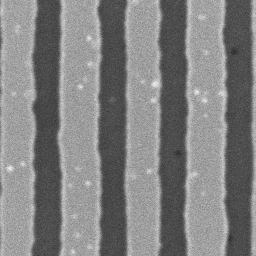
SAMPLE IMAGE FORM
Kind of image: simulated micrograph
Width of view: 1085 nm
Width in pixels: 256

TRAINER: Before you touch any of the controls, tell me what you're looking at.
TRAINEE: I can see lines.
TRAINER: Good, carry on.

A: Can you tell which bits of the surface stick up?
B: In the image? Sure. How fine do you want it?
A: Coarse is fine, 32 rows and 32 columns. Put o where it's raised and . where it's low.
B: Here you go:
ooooo...oooo....oooo...ooooo....
ooooo...oooo....oooo...ooooo....
oooo....oooo....oooo...ooooo....
oooo....oooo....oooo...ooooo....
oooo....oooo....oooo...ooooo....
oooo....ooooo...oooo...ooooo....
oooo....ooooo...oooo...ooooo....
oooo....ooooo...oooo...ooooo....
oooo....oooo....oooo....oooo....
oooo....oooo....oooo...ooooo....
oooo....oooo....oooo...ooooo....
oooo....oooo....oooo...ooooo....
oooo....oooo....oooo...ooooo....
oooo....oooo....oooo....oooo....
oooo....oooo....oooo...ooooo....
oooo....oooo....oooo...ooooo....
oooo...ooooo....oooo...ooooo....
oooo...ooooo....oooo...ooooo....
oooo...ooooo....oooo...ooooo....
oooo....oooo....oooo...ooooo....
oooo....oooo....oooo...ooooo....
oooo....ooooo...oooo...ooooo....
oooo....ooooo...oooo...ooooo....
oooo....ooooo...oooo...ooooo....
oooo....ooooo...oooo...ooooo....
oooo....ooooo...oooo...ooooo....
oooo....ooooo...oooo...ooooo...o
oooo....oooo....oooo...ooooo....
oooo....oooo....oooo...ooooo....
oooo....oooo....oooo...ooooo....
oooo....oooo....oooo...ooooo....
oooo....oooo....oooo...ooooo....